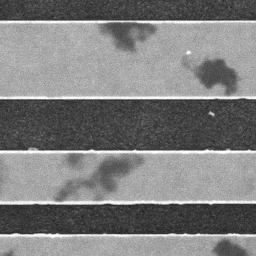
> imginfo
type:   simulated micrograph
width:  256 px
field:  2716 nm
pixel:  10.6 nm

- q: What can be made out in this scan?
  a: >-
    lines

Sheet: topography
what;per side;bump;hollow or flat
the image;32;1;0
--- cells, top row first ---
00000000000000000000000000000000
00000000000000000000000000000000
00000000000000000000000000000000
11111111111111111111111111111111
11111111111111111111111111111111
11111111111111111111111111111111
11111111111111111111111111111111
11111111111111111111111111111111
11111111111111111111111111111111
11111111111111111111111111111111
11111111111111111111111111111111
11111111111111111111111111111111
00000000000000000000000000000000
00000000000000000000000000000000
00000000000000000000000000000000
00000000000000000000000000000000
00000000000000000000000000000000
00000000000000000000000000000000
00000000000000000000000000000000
11111111111111111111111111111111
11111111111111111111111111111111
11111111111111111111111111111111
11111111111111111111111111111111
11111111111111111111111111111111
11111111111111111111111111111111
00000000000000000000000000000000
00000000000000000000000000000000
00000000000000000000000000000000
00000000000000000000000000000000
11111111111111111111111111111111
11111111111111111111111111111111
11111111111111111111111111111111